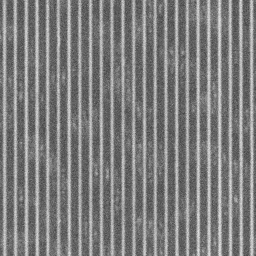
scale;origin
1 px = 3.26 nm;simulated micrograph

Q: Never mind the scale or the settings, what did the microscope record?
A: parallel lines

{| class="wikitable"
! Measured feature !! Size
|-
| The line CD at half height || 8.6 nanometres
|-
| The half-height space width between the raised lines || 26.5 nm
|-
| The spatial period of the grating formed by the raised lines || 10.7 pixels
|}